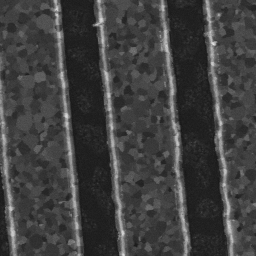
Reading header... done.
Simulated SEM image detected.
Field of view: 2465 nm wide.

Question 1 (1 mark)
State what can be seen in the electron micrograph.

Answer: one or a few lines or trenches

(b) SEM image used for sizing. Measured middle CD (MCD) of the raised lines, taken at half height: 608 nanometres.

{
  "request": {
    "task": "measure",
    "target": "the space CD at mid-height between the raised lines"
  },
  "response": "0.425 microns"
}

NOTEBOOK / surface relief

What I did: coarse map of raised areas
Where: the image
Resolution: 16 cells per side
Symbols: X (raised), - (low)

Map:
XXXX--XXXX---XXX
XXXX--XXXX---XXX
XXXX--XXXX---XXX
XXXX--XXXX---XXX
XXXX---XXXX--XXX
XXXX---XXXX--XXX
XXXX---XXXX---XX
XXXX---XXXX---XX
XXXX---XXXX---XX
XXXX---XXXX---XX
XXXX---XXXX---XX
XXXXX--XXXX---XX
-XXXX--XXXX---XX
-XXXX--XXXX---XX
-XXXX---XXXX--XX
-XXXX---XXXX--XX